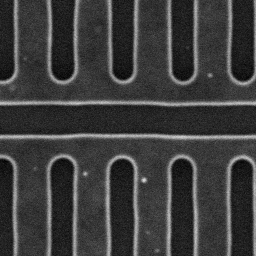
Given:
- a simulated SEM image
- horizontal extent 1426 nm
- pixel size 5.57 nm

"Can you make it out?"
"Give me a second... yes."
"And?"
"groups of lines, slits or small figures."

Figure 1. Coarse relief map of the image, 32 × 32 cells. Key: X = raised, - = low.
--XXXX----XXXX---XXXX---XXXXX---
--XXXX---XXXXX---XXXX---XXXXX---
--XXXX---XXXXX---XXXX---XXXXX---
--XXXX---XXXXX---XXXX---XXXXX---
--XXXX---XXXXX---XXXX---XXXXX---
--XXXX---XXXXX---XXXX---XXXXX---
--XXXX---XXXXX---XXXX---XXXXX---
--XXXX---XXXXX---XXXX---XXXXX---
--XXXX---XXXXX---XXXX---XXXXX---
--XXXXX--XXXXX---XXXXX--XXXXX---
XXXXXXXXXXXXXXXXXXXXXXXXXXXXXXXX
XXXXXXXXXXXXXXXXXXXXXXXXXXXXXXXX
XXXXXXXXXXXXXXXXXXXXXXXXXXXXXXXX
--------------------------------
--------------------------------
--------------------------------
--------------------------------
XXXXXXXXXXXXXXXXXXXXXXXXXXXXXXXX
XXXXXXXXXXXXXXXXXXXXXXXXXXXXXXXX
XXXXXXXXXXXXXXXXXXXXXXXXXXXXXXXX
--XXXX---XXXXX---XXXX---XXXXX---
--XXXX---XXXXX---XXXX---XXXXX---
--XXXX---XXXX----XXXX---XXXXX---
--XXXX---XXXX----XXXX---XXXXX---
--XXXX---XXXX----XXXX---XXXXX---
--XXXX---XXXX----XXXX---XXXXX---
--XXXX---XXXX----XXXX---XXXXX---
--XXXX---XXXXX---XXXX---XXXXX---
--XXXX---XXXXX---XXXX---XXXXX---
--XXXX---XXXXX---XXXX---XXXXX---
--XXXX---XXXXX---XXXX---XXXXX---
--XXXX---XXXXX---XXXX---XXXXX---